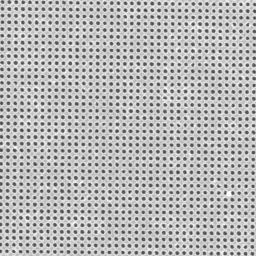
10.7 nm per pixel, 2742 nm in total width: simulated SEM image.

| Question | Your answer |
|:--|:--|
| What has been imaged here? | a regular array of holes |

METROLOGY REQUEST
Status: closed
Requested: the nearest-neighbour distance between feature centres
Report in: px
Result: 6.58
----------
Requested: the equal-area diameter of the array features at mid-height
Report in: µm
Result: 0.0452